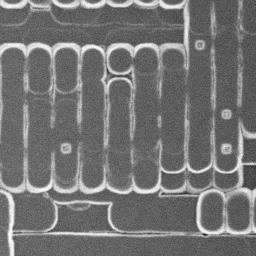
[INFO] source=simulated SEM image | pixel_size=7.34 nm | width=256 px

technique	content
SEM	wiring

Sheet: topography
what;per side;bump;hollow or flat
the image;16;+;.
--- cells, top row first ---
...........+++++
............++++
............++++
++++++++++++++++
++++++++++++++++
++++++++++++++++
++++++++++++++++
++++++++++++++++
+++++++++++++++.
+++++++++++++++.
+++++++++++++++.
++++++++++......
+............+++
+...........++++
+............+..
+...............